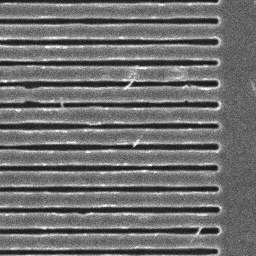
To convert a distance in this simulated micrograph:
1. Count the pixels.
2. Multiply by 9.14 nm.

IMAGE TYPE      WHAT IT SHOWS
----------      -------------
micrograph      parallel lines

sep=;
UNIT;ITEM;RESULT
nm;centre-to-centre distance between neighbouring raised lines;192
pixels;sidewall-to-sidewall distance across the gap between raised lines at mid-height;5.88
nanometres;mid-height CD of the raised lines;140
